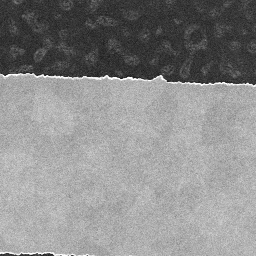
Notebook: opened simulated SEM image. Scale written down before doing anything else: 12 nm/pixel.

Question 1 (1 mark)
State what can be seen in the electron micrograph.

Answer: one or a few lines or trenches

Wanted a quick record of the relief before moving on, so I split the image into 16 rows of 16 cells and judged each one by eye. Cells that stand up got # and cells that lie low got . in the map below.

................
................
................
................
................
################
################
################
################
################
################
################
################
################
################
################